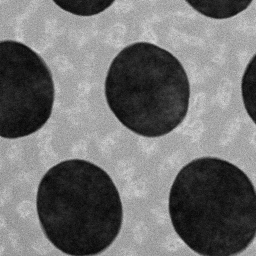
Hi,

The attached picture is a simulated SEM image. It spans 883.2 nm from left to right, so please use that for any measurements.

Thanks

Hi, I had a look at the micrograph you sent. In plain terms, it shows holes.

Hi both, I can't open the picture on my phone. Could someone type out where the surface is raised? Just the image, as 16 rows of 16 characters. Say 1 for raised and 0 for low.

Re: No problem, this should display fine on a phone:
1111000111110001
1111111111111111
1111111111111111
0011111000011111
0001111000001110
0001111000001110
0001111000001110
0001111000011111
0111111110111111
1111111111111111
1110001111100001
1100000111100000
1100000011100000
1100000011100000
1110000111100000
1111000111110001